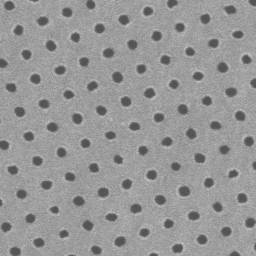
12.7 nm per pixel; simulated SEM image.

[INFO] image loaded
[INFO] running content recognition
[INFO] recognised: a regular array of holes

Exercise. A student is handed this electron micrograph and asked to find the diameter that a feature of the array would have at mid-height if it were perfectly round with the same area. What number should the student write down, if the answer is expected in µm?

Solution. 0.125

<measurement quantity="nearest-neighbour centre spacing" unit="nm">324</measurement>